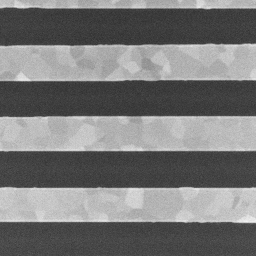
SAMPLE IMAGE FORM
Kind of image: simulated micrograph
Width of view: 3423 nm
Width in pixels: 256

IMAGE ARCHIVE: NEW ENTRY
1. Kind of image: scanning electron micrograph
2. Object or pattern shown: lines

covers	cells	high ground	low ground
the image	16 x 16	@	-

------------@@--
----------------
----------------
@@@@@@@@@@@@@@@@
@@@@@@@@@@@@@@@@
----------------
----------------
@@@@@@@@@@@@@@@@
@@@@@@@@@@@@@@@@
----------------
----------------
----------------
@@@@@@@@@@@@@@@@
@@@@@@@@@@@@@@@@
----------------
----------------